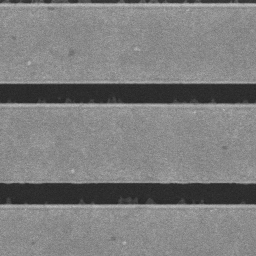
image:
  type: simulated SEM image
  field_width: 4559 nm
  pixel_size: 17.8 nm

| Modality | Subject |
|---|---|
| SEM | lines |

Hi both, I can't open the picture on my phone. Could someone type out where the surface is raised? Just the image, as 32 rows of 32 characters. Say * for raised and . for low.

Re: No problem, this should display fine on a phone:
********************************
********************************
********************************
********************************
********************************
********************************
********************************
********************************
********************************
********************************
................................
................................
................................
********************************
********************************
********************************
********************************
********************************
********************************
********************************
********************************
********************************
********************************
................................
................................
................................
********************************
********************************
********************************
********************************
********************************
********************************